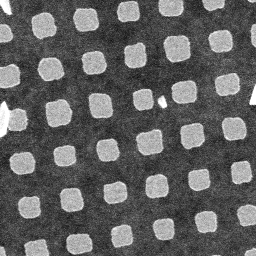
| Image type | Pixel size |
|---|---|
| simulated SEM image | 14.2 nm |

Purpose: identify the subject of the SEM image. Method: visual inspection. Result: a regular array of raised bodies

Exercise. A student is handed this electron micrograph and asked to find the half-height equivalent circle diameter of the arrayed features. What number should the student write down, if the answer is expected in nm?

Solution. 333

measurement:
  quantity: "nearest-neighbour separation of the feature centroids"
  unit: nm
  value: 605